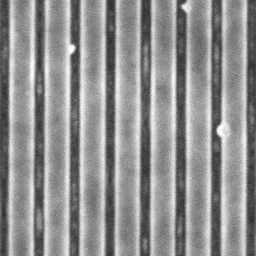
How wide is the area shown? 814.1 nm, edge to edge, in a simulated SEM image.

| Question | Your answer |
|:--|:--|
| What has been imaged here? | parallel lines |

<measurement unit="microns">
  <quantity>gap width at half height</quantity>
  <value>0.0346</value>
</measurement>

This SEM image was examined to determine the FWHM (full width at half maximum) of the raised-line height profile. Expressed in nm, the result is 78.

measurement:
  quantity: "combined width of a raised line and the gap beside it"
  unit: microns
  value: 0.113